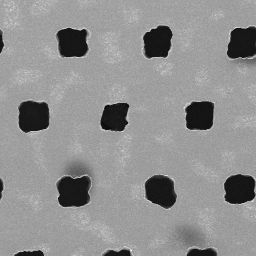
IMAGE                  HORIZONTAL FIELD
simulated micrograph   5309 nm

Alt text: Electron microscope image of a regular array of holes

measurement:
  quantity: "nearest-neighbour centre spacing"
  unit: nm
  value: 1710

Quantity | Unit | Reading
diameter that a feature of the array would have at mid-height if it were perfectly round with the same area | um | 0.643